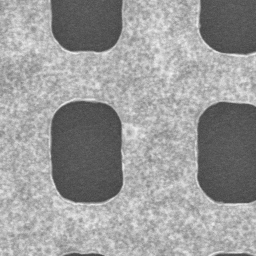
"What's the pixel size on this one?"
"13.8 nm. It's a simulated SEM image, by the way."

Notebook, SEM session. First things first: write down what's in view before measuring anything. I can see holes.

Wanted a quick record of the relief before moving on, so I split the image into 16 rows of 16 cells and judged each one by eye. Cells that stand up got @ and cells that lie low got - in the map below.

@@@-----@@@@@---
@@@-----@@@@----
@@@@---@@@@@@---
@@@@@@@@@@@@@@@@
@@@@@@@@@@@@@@@@
@@@@@@@@@@@@@@@@
@@@@---@@@@@@---
@@@----@@@@@----
@@@-----@@@@----
@@@-----@@@@----
@@@-----@@@@----
@@@-----@@@@----
@@@@---@@@@@@---
@@@@@@@@@@@@@@@@
@@@@@@@@@@@@@@@@
@@@@@@@@@@@@@@@@